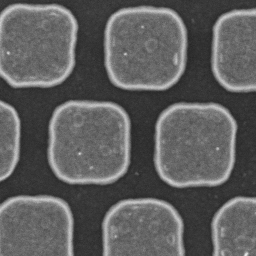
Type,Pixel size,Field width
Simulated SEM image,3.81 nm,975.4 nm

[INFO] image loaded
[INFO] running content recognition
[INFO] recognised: raised bodies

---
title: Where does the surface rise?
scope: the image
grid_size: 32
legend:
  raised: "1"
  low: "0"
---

00000000000000000000000000000000
01111111100000011111110000000111
11111111100000111111110000011111
11111111110001111111111000011111
11111111100001111111111000011111
11111111100001111111111000011111
11111111100001111111111000011111
11111111100001111111111000011111
11111111100001111111111000011111
11111111000000111111110000011111
01111110000000011111110000001111
00000000000000000000000000000000
00000000000000000000000000000000
10000001111111100000011111110000
11000001111111110000111111111000
11000011111111110000111111111000
11000011111111110000111111111000
11000011111111110000111111111000
11000011111111110000111111111000
11000011111111110001111111111000
11000011111111110000111111111000
10000001111111100000111111111000
00000000111111000000011111110000
00000000000000000000000000000000
00000000000000000000000000000000
11111111000000011111100000001111
11111111100000111111110000011111
11111111100001111111111000011111
11111111100001111111111000011111
11111111100001111111111000011111
11111111100001111111111000011111
11111111100001111111111000011111